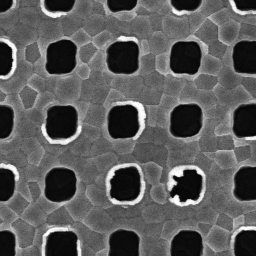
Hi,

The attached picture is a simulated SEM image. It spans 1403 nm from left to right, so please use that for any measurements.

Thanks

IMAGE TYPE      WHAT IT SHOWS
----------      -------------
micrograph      a regular array of holes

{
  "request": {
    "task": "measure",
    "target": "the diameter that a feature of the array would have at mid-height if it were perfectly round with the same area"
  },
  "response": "0.184 um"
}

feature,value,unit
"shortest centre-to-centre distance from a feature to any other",341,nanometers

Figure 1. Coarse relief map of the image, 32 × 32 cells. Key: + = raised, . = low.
.+++++...++++....+++++...++++...
++++++++++++++++++++++++++++++++
++++++++++++++++++++++++++++++++
++++++++++++++++++++++++++++++++
++++++++++++++++++++++++++++++++
.+++++...+++++...+++++...+++++..
.+++++....+++....++++....++++...
..++++...++++....++++....++++...
.+++++...+++++...++++....++++...
++++++++++++++++++++++++++++++++
++++++++++++++++++++++++++++++++
++++++++++++++++++++++++++++++++
++++++++++++++++++++++++++++++++
.+++++...+++++...+++++...+++++..
..++++....++++...++++....++++...
..++++....++++...++++....++++...
.+++++...+++++...++++....++++...
++++++++++++++++++++++++++++++++
++++++++++++++++++++++++++++++++
++++++++++++++++++++++++++++++++
++++++++++++++++++++++++++++++++
.+++++...++++++..++++++..+++++..
..++++....++++....++++...++++...
..++++....++++....++++...++++...
.+++++...+++++...++++....+++++..
++++++++++++++++++++++++++++++++
++++++++++++++++++++++++++++++++
++++++++++++++++++++++++++++++++
++++++++++++++++++++++++++++++++
..++++...+++++...+++++...+++++..
..++++....++++...++++....++++...
..++++....++++...++++....++++...